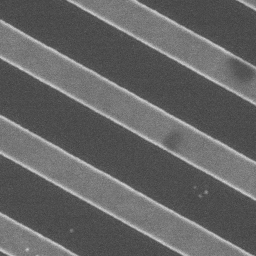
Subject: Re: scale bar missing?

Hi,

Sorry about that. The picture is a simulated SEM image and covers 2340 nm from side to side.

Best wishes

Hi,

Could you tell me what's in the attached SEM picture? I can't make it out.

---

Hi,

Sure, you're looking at lines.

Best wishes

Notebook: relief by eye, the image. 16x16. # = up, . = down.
.....####.......
#......####.....
##.......####...
####......#####.
..####......####
...#####......##
.....####.......
#......####.....
##.......####...
####.......####.
..####......####
...#####......##
.....#####......
.......####.....
##.......####...
####.......####.